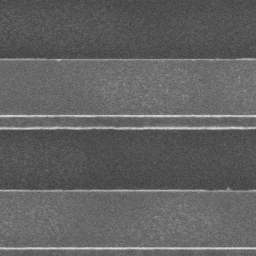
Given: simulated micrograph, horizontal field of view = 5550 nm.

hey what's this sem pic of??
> lines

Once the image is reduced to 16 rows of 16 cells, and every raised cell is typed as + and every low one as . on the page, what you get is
................
................
................
................
++++++++++++++++
++++++++++++++++
++++++++++++++++
++++++++++++++++
................
................
................
................
++++++++++++++++
++++++++++++++++
++++++++++++++++
++++++++++++++++